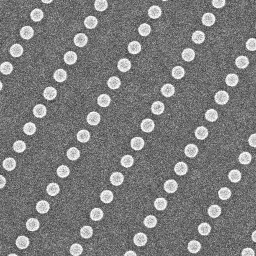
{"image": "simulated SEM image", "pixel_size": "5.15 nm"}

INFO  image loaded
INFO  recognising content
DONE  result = a regular array of raised bodies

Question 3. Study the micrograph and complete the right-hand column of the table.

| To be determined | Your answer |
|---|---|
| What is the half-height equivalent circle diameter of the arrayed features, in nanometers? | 65.7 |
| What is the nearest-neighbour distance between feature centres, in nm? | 104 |